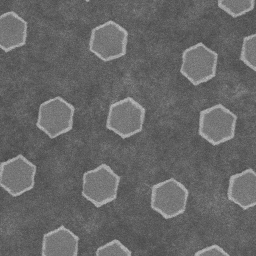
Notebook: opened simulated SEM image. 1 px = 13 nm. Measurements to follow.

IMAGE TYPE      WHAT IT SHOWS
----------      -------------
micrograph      raised bodies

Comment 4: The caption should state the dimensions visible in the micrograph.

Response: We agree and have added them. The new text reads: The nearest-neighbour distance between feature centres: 0.919 um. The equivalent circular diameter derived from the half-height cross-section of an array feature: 461 nanometres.